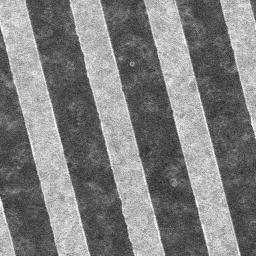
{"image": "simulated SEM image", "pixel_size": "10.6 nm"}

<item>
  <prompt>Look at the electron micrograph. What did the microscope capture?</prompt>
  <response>one or a few lines or trenches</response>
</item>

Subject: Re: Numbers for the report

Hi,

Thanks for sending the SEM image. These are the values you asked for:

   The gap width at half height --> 465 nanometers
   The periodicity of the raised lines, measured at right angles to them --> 769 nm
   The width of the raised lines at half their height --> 306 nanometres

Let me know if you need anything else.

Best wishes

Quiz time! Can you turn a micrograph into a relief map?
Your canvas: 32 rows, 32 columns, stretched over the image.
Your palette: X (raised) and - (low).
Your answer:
XXX------XXXX-----XXXX------XXXX
XXX------XXXX-----XXXX------XXXX
XXXX-----XXXX------XXXXX----XXXX
XXXX-----XXXX------XXXX-----XXXX
XXXX------XXXX-----XXXX------XXX
-XXX------XXXX-----XXXX------XXX
-XXXX-----XXXX----X-XXXX-----XXX
-XXXX------XXX------XXXX-----XXX
-XXXX------XXXX-----XXXX------XX
--XXX------XXXX-----XXXX------XX
--XXXX-----XXXX------XXXX-----XX
--XXXX------XXX------XXXX-----XX
--XXXX------XXXX-----XXXX------X
---XXX------XXXX------XXX------X
---XXXX-----XXXX------XXXX-----X
---XXXX------XXX------XXXX------
----XXX------XXXX-----XXXX------
----XXX------XXXX------XXX------
----XXXX-----XXXX------XXXX-----
----XXXX------XXX------XXXX-----
----XXXX------XXXX-----XXXX-----
-----XXXX-----XXXX------XXX-----
-X---XXXX-----XXXX------XXXX----
-----XXXX------XXX------XXXX----
------XXX------XXXX-----XXXX----
------XXXX-----XXXX------XXX----
------XXXX-----XXXX------XXXX---
X-----XXXX------XXX------XXXX---
X------XXX------XXXX-----XXXX---
X------XXXX-----XXXX------XXX---
XX-----XXXX------XXX------XXXX--
XX-----XXXX------XXX------XXXX--